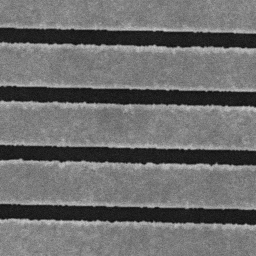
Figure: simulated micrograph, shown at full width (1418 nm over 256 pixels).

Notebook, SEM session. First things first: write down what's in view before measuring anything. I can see lines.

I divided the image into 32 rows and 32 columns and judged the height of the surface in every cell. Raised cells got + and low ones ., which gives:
++++++++++++++++++++++++++++++++
++++++++++++++++++++++++++++++++
++++++++++++++++++++++++++++++++
.........+++++++++++++++++++++++
................................
+...............................
++++++++++++++++++++++++++++++++
++++++++++++++++++++++++++++++++
++++++++++++++++++++++++++++++++
++++++++++++++++++++++++++++++++
++++++++++++++++++++++++++++++++
................................
................................
++++++++++++++++++++++++++++++++
++++++++++++++++++++++++++++++++
++++++++++++++++++++++++++++++++
++++++++++++++++++++++++++++++++
++++++++++++++++++++++++++++++++
.......................+++++++++
................................
+++++++++++.....................
++++++++++++++++++++++++++++++++
++++++++++++++++++++++++++++++++
++++++++++++++++++++++++++++++++
++++++++++++++++++++++++++++++++
.......+++++++++++++++++++++++++
................................
.+..............................
++++++++++++++++++++++++++++++++
++++++++++++++++++++++++++++++++
++++++++++++++++++++++++++++++++
++++++++++++++++++++++++++++++++